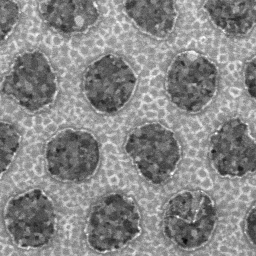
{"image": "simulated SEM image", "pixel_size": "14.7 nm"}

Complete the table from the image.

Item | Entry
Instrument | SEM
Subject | raised bodies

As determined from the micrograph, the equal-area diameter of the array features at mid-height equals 817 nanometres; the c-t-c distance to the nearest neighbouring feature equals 76.5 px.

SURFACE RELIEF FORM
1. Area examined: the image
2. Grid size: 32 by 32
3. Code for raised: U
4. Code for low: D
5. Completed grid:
UUDDDUUUUUUUDDDDUUUUUUDDDUUUUUUU
UUDDDUUUUUUUDDDUUUUUUUDDDDUUUUUU
UUDDDDUUUUUUDDDDUUUUUUDDDDUUUUUU
UUDDDDUUUUUDDDDDDUUUUUDDDDDUUUUD
UDDDDDDDDDDDDDDDDDDUUDDDDDDDDDDD
DDDDDDDDDDDDDDDDDDDDDDDDDDDDDDDD
DDDUUDDDDDDDDDDDDDDDDDDUDDDDDDDD
DDUUUUDDDDDDUUUDDDDDDDUUUUDDDDDU
DUUUUUDDDDDUUUUUDDDDDUUUUUUDDDDU
DUUUUUUDDDDUUUUUUDDDDUUUUUUDDDDU
UUUUUUUDDDUUUUUUUDDDDUUUUUUDDDDU
UUUUUUUDDDUUUUUUUDDDDUUUUUUDDDDU
DDUUUUUDDDDUUUUUDDDDDUUUUUDDDDDD
DDDUUUDDDDDDUUUDDDDDDDUUUUDDDDDD
DDDDDDDDDDDDDDDDDDDDDDDDDDDDDDDD
UDDDDDDDDDDDDDDDDDDUDDDDDDDDUUUD
UUDDDDDUUUUDDDDDUUUUUUDDDDDUUUUD
UUDDDDUUUUUUDDDDUUUUUUDDDDUUUUUU
UUDDDDUUUUUUDDDDUUUUUUUDDDUUUUUU
UUDDDDUUUUUUUDDDUUUUUUUDDDUUUUUU
UDDDDDUUUUUUDDDDDUUUUUDDDDUUUUUU
UDDDDDUUUUUUDDDDDUUUUUDDDDDUUUUD
DDDDDDDUUUDDDDDDDDUUUDDDDDDDDDDD
DDDDDDDDDDDDDDDDDDDDDDDDDDDDDDDD
DDUUUUDDDDDDDUUUDDDDDDUUUUDDDDDD
DUUUUUUDDDDDUUUUUDDDDUUUUUUDDDDD
DUUUUUUDDDDUUUUUUDDDDUUUUUUDDDDU
DUUUUUUDDDDUUUUUUDDDUUUUUUUDDDDU
DUUUUUUDDDDUUUUUUDDDUUUUUUUDDDDU
DUUUUUUDDDDUUUUUUDDDDUUUUUDDDDDU
DDUUUUDDDDDUUUUUDDDDDDUUUDDDDDDD
DDDDDDDDDDDDDDDDDDDDDDDDDDDDDDDD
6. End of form